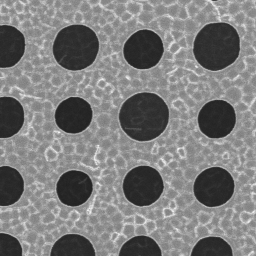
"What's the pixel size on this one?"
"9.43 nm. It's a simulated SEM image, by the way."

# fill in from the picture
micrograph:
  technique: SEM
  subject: a regular array of holes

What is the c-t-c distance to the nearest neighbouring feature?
640 nm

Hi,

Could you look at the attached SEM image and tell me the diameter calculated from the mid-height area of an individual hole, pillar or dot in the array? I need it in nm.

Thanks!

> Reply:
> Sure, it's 384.